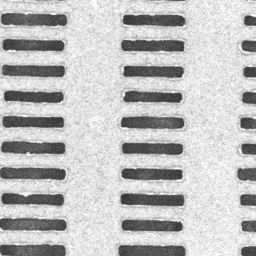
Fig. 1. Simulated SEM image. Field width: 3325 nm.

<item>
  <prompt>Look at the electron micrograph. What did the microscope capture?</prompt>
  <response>a regular array of holes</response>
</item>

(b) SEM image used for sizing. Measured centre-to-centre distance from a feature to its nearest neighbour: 331 nanometres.